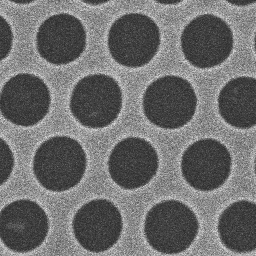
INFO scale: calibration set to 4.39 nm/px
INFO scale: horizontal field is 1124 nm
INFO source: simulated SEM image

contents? a regular array of holes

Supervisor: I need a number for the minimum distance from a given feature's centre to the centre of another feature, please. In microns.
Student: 0.314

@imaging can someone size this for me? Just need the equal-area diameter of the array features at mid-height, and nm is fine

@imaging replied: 237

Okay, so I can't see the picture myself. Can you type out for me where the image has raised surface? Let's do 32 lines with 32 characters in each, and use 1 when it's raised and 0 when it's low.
11111111111001111111011111111000
11111111111111111111111111111111
01111100001111000001111100001111
01111000000111000000111000000111
00111000000111000000111000000111
01110000000110000000111000000111
01111000001111000000111000000111
11111100011111000001111000001111
11111111111111110111111110111111
11001111111000111111101111111111
10000011110000011110000011110000
00000011100000011100000011100000
00000011100000011100000001100000
00000011100000011100000001100000
00000011100000011100000011110000
11000111110000111110000111111000
11111111111111111111111111111111
01111100011111100011111110011111
01111000001111000001111000001111
00110000000111000000111000000111
00110000000110000000111000000111
00110000000111000000111000000111
01111000001111000001111000001111
11111100011111100111111100011111
11111111111111111111111111111111
10000111111000111111000111111000
00000011110000011100000011110000
00000011100000011100000001100000
00000011100000011100000001100000
00000011100000011100000001100000
00000111110000111110000011110000
11011111111001111111000111111001